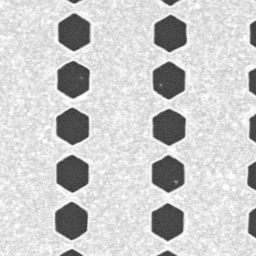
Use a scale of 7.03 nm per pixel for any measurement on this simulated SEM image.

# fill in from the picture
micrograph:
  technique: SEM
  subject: a regular array of holes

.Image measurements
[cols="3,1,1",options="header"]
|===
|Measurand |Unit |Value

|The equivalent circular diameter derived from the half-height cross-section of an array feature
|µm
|0.248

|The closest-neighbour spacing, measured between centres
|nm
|330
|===